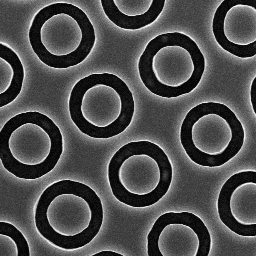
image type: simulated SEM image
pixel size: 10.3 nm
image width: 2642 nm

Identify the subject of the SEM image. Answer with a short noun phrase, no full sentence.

ring-shaped grooves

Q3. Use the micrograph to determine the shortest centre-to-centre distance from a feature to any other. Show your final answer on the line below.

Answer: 825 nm